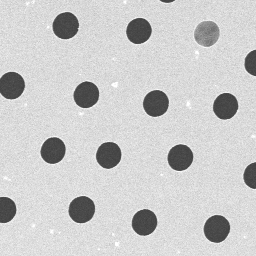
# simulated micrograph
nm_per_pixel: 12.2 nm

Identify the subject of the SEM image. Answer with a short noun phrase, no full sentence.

a regular array of holes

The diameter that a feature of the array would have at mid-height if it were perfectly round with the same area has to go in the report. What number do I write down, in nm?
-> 320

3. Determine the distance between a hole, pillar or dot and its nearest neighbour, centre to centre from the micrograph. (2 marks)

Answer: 783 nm